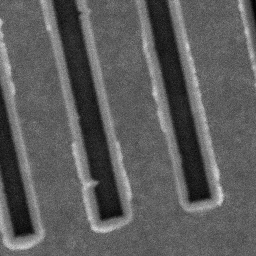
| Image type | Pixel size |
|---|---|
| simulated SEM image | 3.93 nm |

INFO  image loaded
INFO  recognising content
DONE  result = one or a few lines or trenches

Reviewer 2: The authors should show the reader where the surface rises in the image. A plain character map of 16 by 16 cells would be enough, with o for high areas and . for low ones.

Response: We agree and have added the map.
ooo..oooo..oooo.
ooo..oooo..ooooo
ooo...ooo..ooooo
oooo..ooo...oooo
oooo..oooo..oooo
oooo..oooo..oooo
.ooo..oooo..oooo
.oooo..ooo..oooo
.oooo..oooo..ooo
.oooo..oooo..ooo
..ooo..oooo..ooo
..oooo..ooo..ooo
..oooo..oooo.ooo
..oooo..oooooooo
o.oooooooooooooo
oooooooooooooooo